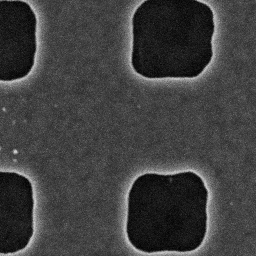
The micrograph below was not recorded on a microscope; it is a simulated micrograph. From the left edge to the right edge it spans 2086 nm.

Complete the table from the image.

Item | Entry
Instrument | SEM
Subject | holes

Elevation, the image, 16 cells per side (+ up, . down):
..+++++++....+++
..++++++.....+++
..++++++.....+++
..++++++.....+++
..+++++++....+++
++++++++++++++++
++++++++++++++++
++++++++++++++++
++++++++++++++++
++++++++++++++++
++++++++++++++++
..++++++.....+++
..++++++.....+++
..++++++.....+++
..++++++.....+++
.++++++++...++++